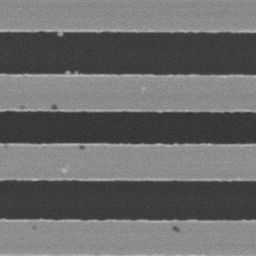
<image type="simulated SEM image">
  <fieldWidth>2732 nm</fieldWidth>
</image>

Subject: lines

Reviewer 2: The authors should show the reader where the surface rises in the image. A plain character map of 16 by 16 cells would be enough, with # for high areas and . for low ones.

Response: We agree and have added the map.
################
################
................
................
................
################
################
................
................
################
################
................
................
................
################
################